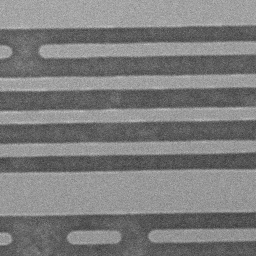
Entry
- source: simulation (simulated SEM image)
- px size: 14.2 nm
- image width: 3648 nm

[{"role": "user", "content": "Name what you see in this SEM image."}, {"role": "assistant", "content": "groups of lines, slits or small figures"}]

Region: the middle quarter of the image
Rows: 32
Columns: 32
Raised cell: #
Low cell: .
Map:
................................
................................
................................
............####################
################################
################################
................................
................................
................................
................................
................................
.....................###########
################################
################################
########........................
................................
................................
................................
................................
................................
################################
################################
#######################.........
................................
................................
................................
................................
################################
################################
################################
################################
################################